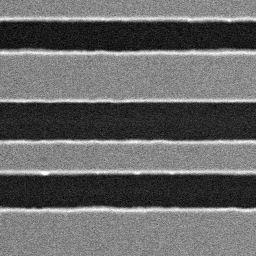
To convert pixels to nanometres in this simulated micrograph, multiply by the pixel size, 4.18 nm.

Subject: lines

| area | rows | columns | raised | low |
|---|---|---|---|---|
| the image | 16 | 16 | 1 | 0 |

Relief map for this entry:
1111111111111111
0000000000000000
0000000000000000
1111111111111111
1111111111111111
1111111111111111
0000000000000000
0000000000000000
0000000000000000
1111111111111111
1111111111111111
0000000000000000
0000000000000000
1111111111111111
1111111111111111
1111111111111111